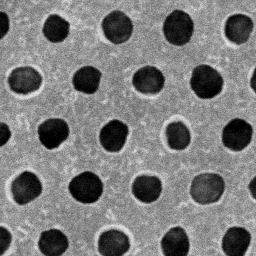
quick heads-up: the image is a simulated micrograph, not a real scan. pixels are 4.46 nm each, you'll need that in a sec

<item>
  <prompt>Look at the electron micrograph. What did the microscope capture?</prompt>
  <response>a regular array of holes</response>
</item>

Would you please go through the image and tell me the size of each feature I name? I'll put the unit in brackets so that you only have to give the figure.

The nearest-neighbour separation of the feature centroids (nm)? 266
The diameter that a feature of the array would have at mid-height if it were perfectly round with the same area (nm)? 145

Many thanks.